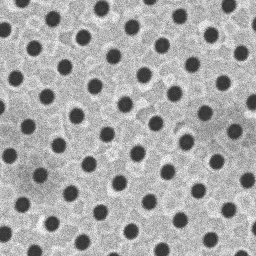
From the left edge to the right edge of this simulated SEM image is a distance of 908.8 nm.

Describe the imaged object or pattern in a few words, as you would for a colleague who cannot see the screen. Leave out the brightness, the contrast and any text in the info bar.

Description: a regular array of holes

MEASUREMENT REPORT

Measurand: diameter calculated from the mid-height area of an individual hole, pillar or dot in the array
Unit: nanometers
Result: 53.5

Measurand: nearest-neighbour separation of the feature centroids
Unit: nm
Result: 123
